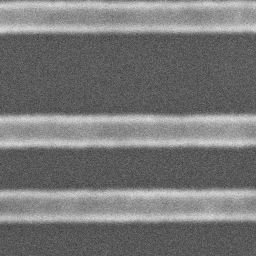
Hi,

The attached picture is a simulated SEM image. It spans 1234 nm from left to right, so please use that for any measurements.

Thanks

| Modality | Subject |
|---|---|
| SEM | lines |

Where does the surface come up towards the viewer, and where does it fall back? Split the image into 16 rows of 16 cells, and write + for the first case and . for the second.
++++++++++++++++
++++++++++++++++
................
................
................
................
................
++++++++++++++++
++++++++++++++++
................
................
................
++++++++++++++++
++++++++++++++++
................
................